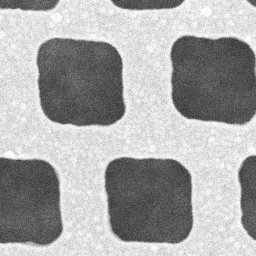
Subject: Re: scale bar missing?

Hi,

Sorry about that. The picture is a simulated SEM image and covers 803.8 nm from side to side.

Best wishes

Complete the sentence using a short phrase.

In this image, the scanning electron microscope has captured holes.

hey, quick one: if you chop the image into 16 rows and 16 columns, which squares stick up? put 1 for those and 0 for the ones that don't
0001111100011111
1111111111111111
1110001111100001
1100000111100000
1100000011100000
1100000011100000
1110000011100000
1110000111110000
1111111111111111
1111111111111111
0001111000001110
0000111000001110
0000111000001110
0000111000001110
0000111000001110
1111111111111111